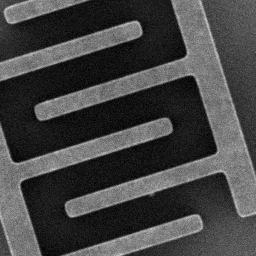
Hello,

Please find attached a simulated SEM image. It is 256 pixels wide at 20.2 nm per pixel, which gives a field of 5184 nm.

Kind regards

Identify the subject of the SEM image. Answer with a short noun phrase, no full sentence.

groups of lines, slits or small figures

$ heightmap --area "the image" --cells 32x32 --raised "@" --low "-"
--@@@@@@@@------------@@@-------
-@@@@@----------------@@@-------
-@@-------------------@@@@------
--------------@@@@----@@@@------
-----------@@@@@@------@@@------
-------@@@@@@@@--------@@@@-----
----@@@@@@@------------@@@@-----
-@@@@@@@--------------@@@@@-----
@@@@@--------------@@@@@@@@@----
@@--------------@@@@@@@-@@@@----
-------------@@@@@@@-----@@@----
----------@@@@@@@--------@@@@---
------@@@@@@@------------@@@@---
----@@@@@@----------------@@@---
-----@@-------------------@@@@--
------------------@@@-----@@@@--
---------------@@@@@@------@@@--
@-----------@@@@@@@--------@@@@-
@--------@@@@@@@-----------@@@@-
@----@@@@@@@--------------@@@@@-
@@@@@@@@@--------------@@@@@@@@@
@@@@@@--------------@@@@@@@@@@@@
@@@--------------@@@@@@@----@@@@
@@@-----------@@@@@@@--------@@@
@@@-------@@@@@@@@-----------@@@
@@@-----@@@@@@@--------------@@@
@@@-----@@@-------------------@@
@@@@------------------@@@-------
@@@@---------------@@@@@@-------
-@@@------------@@@@@@@---------
-@@@@-------@@@@@@@@------------
-@@@@----@@@@@@@@---------------